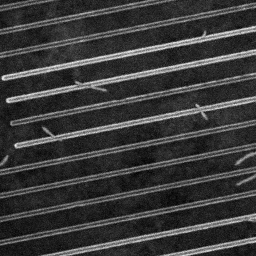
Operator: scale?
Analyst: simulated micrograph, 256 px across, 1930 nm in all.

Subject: parallel lines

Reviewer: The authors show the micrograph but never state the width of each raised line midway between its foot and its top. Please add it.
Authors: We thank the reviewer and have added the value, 28.7 nm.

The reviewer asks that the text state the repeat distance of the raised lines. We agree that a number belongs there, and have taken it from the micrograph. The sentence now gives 173 nm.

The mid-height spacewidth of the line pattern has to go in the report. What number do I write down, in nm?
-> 144